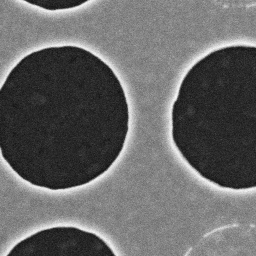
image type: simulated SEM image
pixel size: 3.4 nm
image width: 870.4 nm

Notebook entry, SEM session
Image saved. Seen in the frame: holes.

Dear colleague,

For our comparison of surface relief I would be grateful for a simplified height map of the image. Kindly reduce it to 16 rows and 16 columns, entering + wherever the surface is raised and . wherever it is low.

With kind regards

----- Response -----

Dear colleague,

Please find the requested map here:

+++.++++++++++++
++++++++++++++++
++++++++++++++++
++....+++++++...
+......+++++....
........+++.....
........+++.....
........+++.....
........+++.....
........+++.....
+......+++++....
++...++++++++...
++++++++++++++++
++++++++++++++++
++...+++++++++++
+......+++++++++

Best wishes